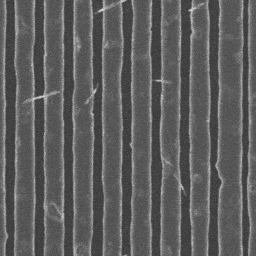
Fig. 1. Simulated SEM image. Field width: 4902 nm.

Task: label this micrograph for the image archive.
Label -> parallel lines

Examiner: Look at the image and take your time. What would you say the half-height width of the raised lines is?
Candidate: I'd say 364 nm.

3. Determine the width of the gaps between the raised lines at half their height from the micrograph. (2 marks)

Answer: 9.5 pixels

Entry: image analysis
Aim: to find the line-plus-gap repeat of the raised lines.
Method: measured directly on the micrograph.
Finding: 563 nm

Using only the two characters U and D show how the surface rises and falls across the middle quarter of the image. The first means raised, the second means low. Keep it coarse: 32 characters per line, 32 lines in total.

DDDUUUUDDDUUUUDDDUUUUUDDDUUUUDDD
DDDUUUUDDDUUUUDDDUUUUUDDUUUUUDDD
DDDUUUUDDDUUUUDDDUUUUUDDUUUUUDDD
DDDUUUUDDDUUUUDDDUUUUUDDUUUUUDDD
DDDUUUUDDDUUUUDDDUUUUUDDUUUUUDDD
DDDUUUUDDDUUUUDDDUUUUUDDDUUUUDDD
DDDUUUUDDDUUUUDDDUUUUUDDDUUUUDDD
DDUUUUUUDDUUUUDDDUUUUUDDUUUUUDDD
DDUUUUUDDDUUUUDDDUUUUUDDUUUUUDDD
DDUUUUUDDDUUUUDDDUUUUUDDUUUUUDDD
DDUUUUUDDDUUUUDDDUUUUUDDUUUUUDDD
DDUUUUUDDDUUUUDDDUUUUUDDUUUUUDDD
DDUUUUUDDDUUUUDDDUUUUUDDUUUUUDDD
DDUUUUUDDDUUUUDDDUUUUUDDUUUUUDDD
DDUUUUUDDDUUUUDDDUUUUUDDUUUUUDDD
DDDUUUUDDDUUUUUDDUUUUUDDUUUUUDDD
DDDUUUUDDDUUUUDDDUUUUUDDUUUUUDDD
DDDUUUUDDDUUUUDDDUUUUUDDUUUUUDDU
DDUUUUUDDDUUUUDDDUUUUUDDUUUUUDDU
DDUUUUUDDDUUUUDDDUUUUUDDUUUUUDDU
DDUUUUUDDDUUUUDDDUUUUUDDUUUUUDDD
DDUUUUUDDDUUUUDDDUUUUUDDUUUUUDDU
DDUUUUUDDDUUUUDDDUUUUUDDUUUUUDDU
DDDUUUUDDDUUUUDDDUUUUUDDUUUUUDDU
DDDUUUUDDDUUUUDDDUUUUUDDDUUUUDDU
DDDUUUUDDDUUUUDDDUUUUUDDDUUUUDDD
DDDUUUUDDDUUUUDDDUUUUUDDDUUUUDDD
DDDUUUUDDDUUUUDDDUUUUUDDDUUUUDDD
DDDUUUUDDDUUUUDDDUUUUUDDDUUUUDDD
DDDUUUUDDDUUUUDDDUUUUUDDDUUUUDDD
DDDUUUUDDDUUUUDDDUUUUUDDUUUUUDDD
DDDUUUUDDDUUUUDDDUUUUUDDUUUUUDDD